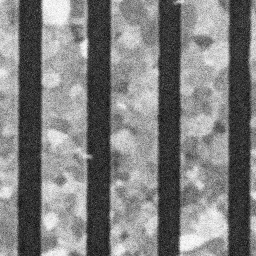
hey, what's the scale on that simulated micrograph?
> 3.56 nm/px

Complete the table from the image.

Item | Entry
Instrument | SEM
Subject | one or a few lines or trenches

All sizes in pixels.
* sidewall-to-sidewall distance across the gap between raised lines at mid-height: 25.8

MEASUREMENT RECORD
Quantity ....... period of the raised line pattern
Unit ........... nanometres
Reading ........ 250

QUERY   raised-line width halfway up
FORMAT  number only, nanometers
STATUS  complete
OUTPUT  159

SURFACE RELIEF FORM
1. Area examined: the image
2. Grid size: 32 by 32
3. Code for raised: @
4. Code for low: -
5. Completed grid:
@@---@@@@@@---@@@@@@---@@@@@----
@@----@@@@@---@@@@@@---@@@@@----
@@----@@@@@---@@@@@@---@@@@@----
@@----@@@@@---@@@@@@---@@@@@----
@@---@@@@@@---@@@@@@---@@@@@----
@@---@@@@@@---@@@@@@---@@@@@---@
@@---@@@@@@---@@@@@@---@@@@@---@
@@---@@@@@@---@@@@@@---@@@@@---@
@@---@@@@@@---@@@@@@---@@@@@---@
@@---@@@@@@---@@@@@@---@@@@@---@
@@---@@@@@@---@@@@@@---@@@@@----
@@---@@@@@@---@@@@@@---@@@@@----
@@---@@@@@@---@@@@@@---@@@@@----
@@---@@@@@@---@@@@@----@@@@@----
@@---@@@@@@---@@@@@@---@@@@@----
@@---@@@@@@---@@@@@@---@@@@@----
@@---@@@@@@---@@@@@@---@@@@@----
@@---@@@@@@---@@@@@@---@@@@@----
@@---@@@@@@---@@@@@@---@@@@@----
@@---@@@@@@---@@@@@@---@@@@@----
@@---@@@@@@---@@@@@@---@@@@@----
@@---@@@@@@---@@@@@@---@@@@@----
@@---@@@@@@---@@@@@@---@@@@@----
@@---@@@@@@---@@@@@@---@@@@@----
@@---@@@@@@---@@@@@@---@@@@@----
@@---@@@@@@---@@@@@@---@@@@@----
@@---@@@@@@---@@@@@@---@@@@@----
@@---@@@@@@---@@@@@@---@@@@@----
@@---@@@@@@---@@@@@@---@@@@@----
@@---@@@@@@---@@@@@@---@@@@@---@
@@---@@@@@@---@@@@@@---@@@@@---@
@@---@@@@@@---@@@@@@---@@@@@---@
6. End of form